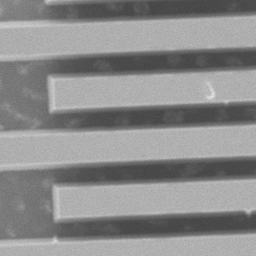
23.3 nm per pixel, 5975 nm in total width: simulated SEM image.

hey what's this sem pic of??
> parallel lines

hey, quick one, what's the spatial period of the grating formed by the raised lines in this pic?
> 1270 nm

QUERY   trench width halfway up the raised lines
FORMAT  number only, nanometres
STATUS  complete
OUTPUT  510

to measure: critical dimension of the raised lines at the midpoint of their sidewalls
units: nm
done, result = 764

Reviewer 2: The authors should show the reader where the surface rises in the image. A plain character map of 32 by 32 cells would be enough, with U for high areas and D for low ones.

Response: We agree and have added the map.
DDDDDDDDDDDDDDDDDDDDDDDDDDDDDDDD
DDDDDDDDDDDDDDDDDDDDDDDDDDDDDDDD
DDDDDDDDDDDDDDDDDUUUUUUUUUUUUUUU
UUUUUUUUUUUUUUUUUUUUUUUUUUUUUUUU
UUUUUUUUUUUUUUUUUUUUUUUUUUUUUUUU
UUUUUUUUUUUUUUUUUUUUUUUUUUUUUUUU
UUUUUUUUUUUUUUUUUDDDDDDDDDDDDDDD
DDDDDDDDDDDDDDDDDDDDDDDDDDDDDDDD
DDDDDDDDDDDDDDDDDDDDDDDDDDDDDDDD
DDDDDDDDDDDDDUUUUUUUUUUUUUUUUUUU
DDDDDDUUUUUUUUUUUUUUUUUUUUUUUUUU
DDDDDDUUUUUUUUUUUUUUUUUUUUUUUUUU
DDDDDDUUUUUUUUUUUUUUUUUUUUUUUUUU
DDDDDDDUUUUUUDDDDDDDDDDDDDDDDDDD
DDDDDDDDDDDDDDDDDDDDDDDDDDDDDDDD
DDDDDDDDDDDDDDDDDDDDDDDDDDDDDDDD
DDDDDDDDDUUUUUUUUUUUUUUUUUUUUUUU
UUUUUUUUUUUUUUUUUUUUUUUUUUUUUUUU
UUUUUUUUUUUUUUUUUUUUUUUUUUUUUUUU
UUUUUUUUUUUUUUUUUUUUUUUUUUUUUUUU
UUUUUUUUUDDDDDDDDDDDDDDDDDDDDDDD
DDDDDDDDDDDDDDDDDDDDDDDDDDDDDDDD
DDDDDDDDDDDDDDDDDDDDDDDDDDDUDUUU
DDDDDDDUUUUUUUUUUUUUUUUUUUUUUUUU
DDDDDDDUUUUUUUUUUUUUUUUUUUUUUUUU
DDDDDDDUUUUUUUUUUUUUUUUUUUUUUUUU
DDDDDDDUUUUUUUUUUUUUUUUUUUUUUDUU
DDDDDDDDDDDDDDDDDDDDDDDDDDDDDDDD
DDDDDDDDDDDDDDDDDDDDDDDDDDDDDDDD
DDDDDDDDDDDDDDDDDDDDDDDUDUUUUUUU
UUUUUUUUUUUUUUUUUUUUUUUUUUUUUUUU
UUUUUUUUUUUUUUUUUUUUUUUUUUUUUUUU